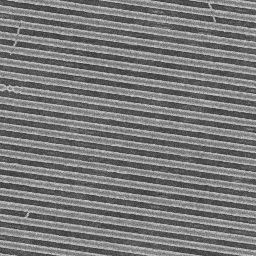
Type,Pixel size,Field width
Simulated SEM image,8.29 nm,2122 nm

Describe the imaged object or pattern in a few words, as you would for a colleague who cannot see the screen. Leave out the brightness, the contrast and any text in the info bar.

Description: parallel lines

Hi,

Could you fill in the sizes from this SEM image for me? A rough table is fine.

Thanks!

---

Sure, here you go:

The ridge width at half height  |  47.1 nanometres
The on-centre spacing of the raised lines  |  107 nanometers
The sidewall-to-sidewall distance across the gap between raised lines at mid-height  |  55.4 nanometres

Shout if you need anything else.